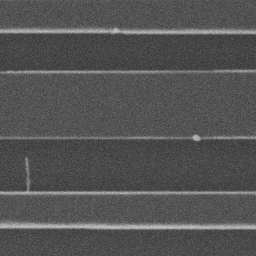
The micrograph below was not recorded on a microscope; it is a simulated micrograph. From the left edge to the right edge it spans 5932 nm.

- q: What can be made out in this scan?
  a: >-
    lines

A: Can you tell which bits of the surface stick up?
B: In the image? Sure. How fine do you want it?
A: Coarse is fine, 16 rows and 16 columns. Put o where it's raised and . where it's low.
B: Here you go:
oooooooooooooooo
oooooooooooooooo
................
................
oooooooooooooooo
oooooooooooooooo
oooooooooooooooo
oooooooooooooooo
oooooooooooooooo
................
................
................
oooooooooooooooo
oooooooooooooooo
................
................